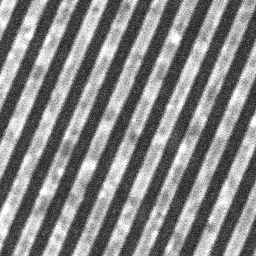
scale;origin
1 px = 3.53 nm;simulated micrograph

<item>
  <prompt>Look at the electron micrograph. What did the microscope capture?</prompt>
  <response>parallel lines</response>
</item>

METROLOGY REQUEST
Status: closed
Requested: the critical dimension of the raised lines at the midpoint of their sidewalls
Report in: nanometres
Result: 40.9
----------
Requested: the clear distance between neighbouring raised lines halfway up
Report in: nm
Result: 58.3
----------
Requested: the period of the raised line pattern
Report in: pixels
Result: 27.6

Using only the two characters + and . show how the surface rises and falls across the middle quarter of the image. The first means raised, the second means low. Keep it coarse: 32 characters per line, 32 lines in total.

+++.....+++....++++....+++.....+
+++....++++....+++....++++....++
++.....+++.....+++....+++.....++
++.....+++....+++.....+++....+++
++....+++.....+++....+++.....+++
+.....+++....++++....+++....++++
+....+++.....+++....+++.....+++.
.....+++.....+++....+++.....+++.
....++++....+++....++++....+++..
....+++.....+++....+++.....+++..
....+++....+++.....+++....+++...
...+++.....+++....+++.....+++...
...+++....+++.....+++....+++....
...++.....+++....+++.....+++....
..+++....++++....+++.....+++....
..++.....+++....++++....+++.....
.+++.....+++....+++.....+++....+
.+++....+++.....+++....+++.....+
+++.....+++....+++.....+++....++
+++....+++.....+++....+++.....++
++.....+++....+++.....+++.....++
++....++++....+++.....++.....+++
+.....+++....++++....+++.....+++
+.....++.....+++.....+++....+++.
+....+++.....+++....+++.....+++.
.....+++....+++.....+++....+++..
....+++.....+++....+++.....+++..
....+++.....++.....+++....+++...
...+++.....+++....++++....+++...
...+++....+++.....+++.....+++...
...++.....+++.....+++....+++....
..+++.....+++....+++.....+++....